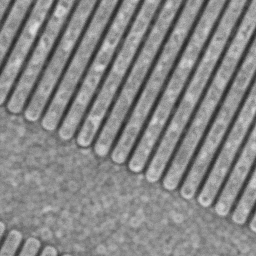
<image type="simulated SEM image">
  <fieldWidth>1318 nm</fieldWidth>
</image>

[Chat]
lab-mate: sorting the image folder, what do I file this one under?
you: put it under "parallel lines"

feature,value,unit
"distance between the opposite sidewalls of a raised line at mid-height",65.3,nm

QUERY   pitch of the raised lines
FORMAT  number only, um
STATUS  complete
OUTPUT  0.0981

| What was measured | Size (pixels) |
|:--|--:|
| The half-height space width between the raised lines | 6.39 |